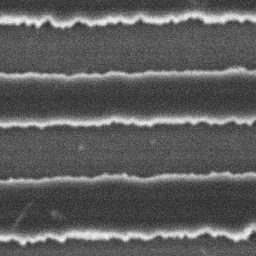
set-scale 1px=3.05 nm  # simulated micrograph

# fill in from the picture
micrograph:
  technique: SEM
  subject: lines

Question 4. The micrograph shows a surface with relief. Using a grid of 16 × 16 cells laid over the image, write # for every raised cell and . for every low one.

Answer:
################
...#.#..........
................
................
.........#######
################
################
################
................
................
................
################
################
################
################
................